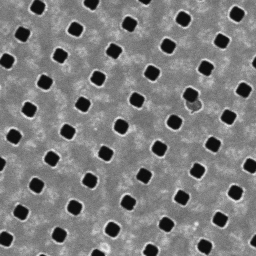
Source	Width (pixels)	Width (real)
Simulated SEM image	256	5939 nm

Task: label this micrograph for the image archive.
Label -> a regular array of holes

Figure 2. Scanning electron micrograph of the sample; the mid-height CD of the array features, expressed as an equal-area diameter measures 347 nm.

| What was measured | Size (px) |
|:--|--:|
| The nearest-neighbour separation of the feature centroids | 30.9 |